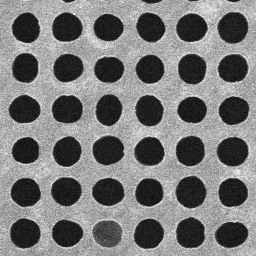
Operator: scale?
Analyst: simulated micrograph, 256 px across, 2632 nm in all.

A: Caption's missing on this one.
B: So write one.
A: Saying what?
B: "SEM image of a regular array of holes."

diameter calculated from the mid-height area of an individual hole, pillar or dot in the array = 302 nanometers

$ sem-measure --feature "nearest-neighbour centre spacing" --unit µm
0.419